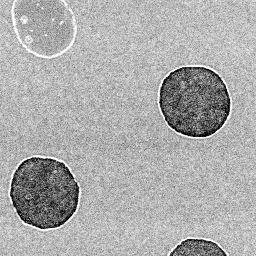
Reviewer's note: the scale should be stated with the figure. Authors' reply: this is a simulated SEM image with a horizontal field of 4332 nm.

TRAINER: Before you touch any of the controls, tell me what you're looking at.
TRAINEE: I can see holes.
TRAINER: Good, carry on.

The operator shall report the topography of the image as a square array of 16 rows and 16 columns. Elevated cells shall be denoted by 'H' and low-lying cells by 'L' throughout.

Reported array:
HLLLHHHHHHHHHHHH
HLLLLHHHHHHHHHHH
HLLLLHHHHHHHHHHH
HHHHHHHHHHHHHHHH
HHHHHHHHHHHLLHHH
HHHHHHHHHHLLLLHH
HHHHHHHHHHLLLLHH
HHHHHHHHHHLLLLHH
HHHHHHHHHHHHLHHH
HHHHHHHHHHHHHHHH
HLLLHHHHHHHHHHHH
HLLLLHHHHHHHHHHH
HLLLLHHHHHHHHHHH
HLLLHHHHHHHHHHHH
HHHHHHHHHHHHHHHH
HHHHHHHHHHHLLLHH